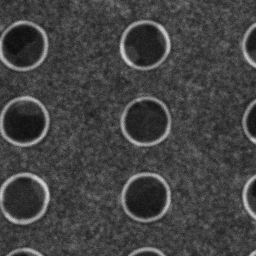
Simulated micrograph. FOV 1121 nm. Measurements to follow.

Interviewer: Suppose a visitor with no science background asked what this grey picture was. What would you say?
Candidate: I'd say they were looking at raised bodies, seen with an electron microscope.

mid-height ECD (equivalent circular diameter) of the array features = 0.207 um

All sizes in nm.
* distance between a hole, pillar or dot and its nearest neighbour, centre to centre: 333